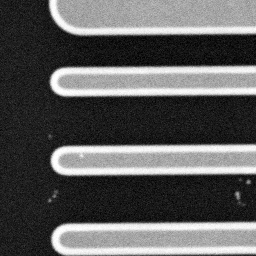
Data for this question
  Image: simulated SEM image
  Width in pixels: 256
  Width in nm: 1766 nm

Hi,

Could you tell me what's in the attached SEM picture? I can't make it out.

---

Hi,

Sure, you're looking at groups of lines, slits or small figures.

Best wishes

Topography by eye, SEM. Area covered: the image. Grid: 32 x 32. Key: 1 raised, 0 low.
00000001111111111111111111111111
00000001111111111111111111111111
00000001111111111111111111111111
00000000111111111111111111111111
00000000000000000000000000000000
00000000000000000000000000000000
00000000000000000000000000000000
00000000000000000000000000000000
00000000000000000000000000000000
00000001111111111111111111111111
00000001111111111111111111111111
00000000111111111111100000000000
00000000000000000000000000000000
00000000000000000000000000000000
00000000000000000000000000000000
00000000000000000000000000000000
00000000000000000000000000000000
00000000000000000000000000000000
00000000000000000000000000000111
00000001111111111111111111111111
00000001111111111111111111111111
00000000111111000000000000000000
00000000000000000000000000000000
00000000000000000000000000000000
00000000000000000000000000000000
00000000000000000000000000000000
00000000000000000000000000000000
00000000000000000000000000000000
00000000111111111111111111111111
00000001111111111111111111111111
00000001111111111111111111111111
00000000111000000000000000000000